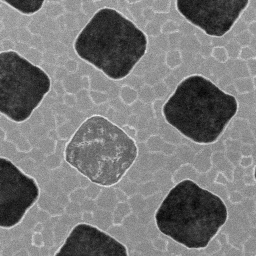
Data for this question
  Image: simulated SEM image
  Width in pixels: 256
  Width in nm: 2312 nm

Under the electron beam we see holes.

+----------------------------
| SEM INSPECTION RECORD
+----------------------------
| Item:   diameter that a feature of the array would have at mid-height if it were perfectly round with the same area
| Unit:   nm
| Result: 593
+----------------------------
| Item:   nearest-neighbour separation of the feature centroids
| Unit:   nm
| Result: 960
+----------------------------